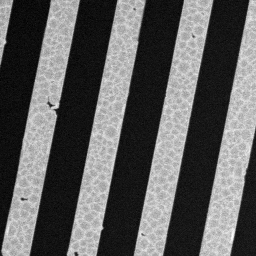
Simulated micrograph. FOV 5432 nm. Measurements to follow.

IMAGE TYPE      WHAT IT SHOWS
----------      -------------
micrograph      one or a few lines or trenches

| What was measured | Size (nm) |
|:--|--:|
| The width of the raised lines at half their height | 575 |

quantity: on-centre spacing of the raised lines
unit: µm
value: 1.38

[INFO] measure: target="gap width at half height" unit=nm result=802